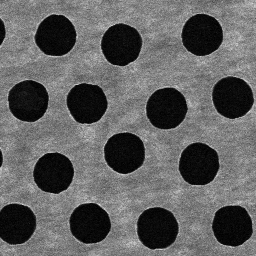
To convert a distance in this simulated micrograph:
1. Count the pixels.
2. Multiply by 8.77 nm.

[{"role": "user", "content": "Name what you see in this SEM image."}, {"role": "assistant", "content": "a regular array of holes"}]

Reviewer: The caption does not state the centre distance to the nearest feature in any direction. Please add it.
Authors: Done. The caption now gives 562 nm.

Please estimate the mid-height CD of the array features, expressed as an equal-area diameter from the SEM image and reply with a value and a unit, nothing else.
364 nm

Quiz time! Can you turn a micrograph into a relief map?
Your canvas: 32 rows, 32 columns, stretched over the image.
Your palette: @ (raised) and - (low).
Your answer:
@@@@@@@@@@@@@@@@@@@@@@@@@@@@@@@@
@@@@@@@@@@@@@@@@@@@@@@@@@@@@@@@@
@@@@@----@@@@@@@@@@@@@@----@@@@@
-@@@@----@@@@@---@@@@@@-----@@@@
-@@@------@@@-----@@@@@-----@@@@
@@@@@----@@@@-----@@@@@-----@@@@
@@@@@----@@@@-----@@@@@@---@@@@@
@@@@@@@@@@@@@----@@@@@@@@@@@@@@@
@@@@@@@@@@@@@@@@@@@@@@@@@@@@@@@@
@@@@@@@@@@@@@@@@@@@@@@@@@@@@@@@@
@@---@@@@@-@@@@@@@@@@@@@@@@----@
@-----@@@----@@@@@@---@@@@@-----
@-----@@-----@@@@@@----@@@@-----
@-----@@-----@@@@@-----@@@@----@
@@---@@@@----@@@@@-----@@@@@--@@
@@@@@@@@@@@@@@@@@@@---@@@@@@@@@@
@@@@@@@@@@@@@@@@@@@@@@@@@@@@@@@@
@@@@@@@@@@@@@@----@@@@@@@@@@@@@@
@@@@@@@@@@@@@-----@@@@@---@@@@@@
@@@@@---@@@@@-----@@@@@----@@@@@
@@@@-----@@@@-----@@@@-----@@@@@
@@@@-----@@@@@@--@@@@@-----@@@@@
@@@@-----@@@@@@@@@@@@@@----@@@@@
@@@@@---@@@@@@@@@@@@@@@@@@@@@@@@
@@@@@@@@@@@@@@@@@@@@@@@@@@@@@@@@
@-@@@@@@@@--@@@@@@@@@@@@@@@@@@@@
----@@@@@----@@@@@---@@@@@@----@
-----@@@@-----@@@-----@@@@@----@
----@@@@@-----@@@-----@@@@@-----
----@@@@@----@@@@-----@@@@@----@
@--@@@@@@@@@@@@@@@---@@@@@@@--@@
@@@@@@@@@@@@@@@@@@@@@@@@@@@@@@@@